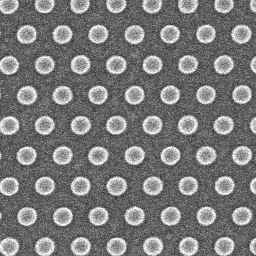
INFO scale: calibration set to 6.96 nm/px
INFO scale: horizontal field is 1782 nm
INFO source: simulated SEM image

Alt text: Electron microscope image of a regular array of raised bodies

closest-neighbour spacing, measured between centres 243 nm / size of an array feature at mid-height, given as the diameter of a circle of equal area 129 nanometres